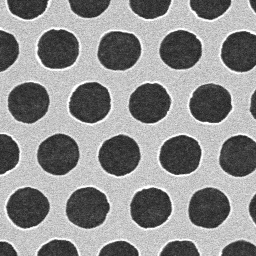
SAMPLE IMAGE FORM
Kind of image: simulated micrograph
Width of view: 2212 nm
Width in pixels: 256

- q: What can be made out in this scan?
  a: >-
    a regular array of holes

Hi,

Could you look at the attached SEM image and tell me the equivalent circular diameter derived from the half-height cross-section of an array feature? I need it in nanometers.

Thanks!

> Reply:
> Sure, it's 360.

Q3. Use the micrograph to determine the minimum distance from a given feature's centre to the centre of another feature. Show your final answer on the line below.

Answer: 515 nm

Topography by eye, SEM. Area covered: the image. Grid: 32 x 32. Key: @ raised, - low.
@-----@@@-----@@-----@@@-----@@-
@----@@@@----@@@@----@@@----@@@@
@@@-@@@@@@@@@@@@@@@@@@@@@@@@@@@@
@@@@@@@@@@@@@@@@@@@@@@@@@@@@@@@@
--@@@----@@@@----@@@@---@@@@@---
--@@@-----@@------@@-----@@@----
--@@@-----@@------@@-----@@@----
--@@@----@@@-----@@@-----@@@----
-@@@@@--@@@@@---@@@@@---@@@@@---
@@@@@@@@@@@@@@@@@@@@@@@@@@@@@@@@
@@@--@@@@@---@@@@@--@@@@@@@@@@@@
@-----@@@-----@@@----@@@-----@@@
@-----@@@-----@@-----@@@-----@@-
@-----@@@-----@@-----@@@-----@@-
@@---@@@@----@@@@----@@@----@@@@
@@@@@@@@@@@@@@@@@@@@@@@@@@@@@@@@
@@@@@@@@@@@@@@@@@@@@@@@@@@@@@@@@
--@@@@---@@@@----@@@@---@@@@----
--@@@-----@@-----@@@-----@@@----
--@@@-----@@------@@-----@@-----
--@@@-----@@@----@@@-----@@-----
-@@@@@---@@@@---@@@@@---@@@@----
@@@@@@@@@@@@@@@@@@@@@@@@@@@@@@@@
@@@-@@@@@@-@@@@@@@@@@@@@@@-@@@@@
@-----@@@----@@@@----@@@----@@@@
@-----@@------@@-----@@@-----@@-
@-----@@------@@-----@@@-----@@-
@----@@@@----@@@@----@@@----@@@@
@@@-@@@@@@--@@@@@@-@@@@@@@-@@@@@
@@@@@@@@@@@@@@@@@@@@@@@@@@@@@@@@
-@@@@@---@@@@@--@@@@@---@@@@@---
--@@@-----@@-----@@@-----@@@----